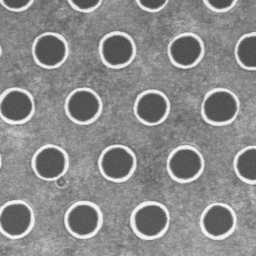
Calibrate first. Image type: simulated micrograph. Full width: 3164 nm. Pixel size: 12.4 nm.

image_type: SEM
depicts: a regular array of raised bodies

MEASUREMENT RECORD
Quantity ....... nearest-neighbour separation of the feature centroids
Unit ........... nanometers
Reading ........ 812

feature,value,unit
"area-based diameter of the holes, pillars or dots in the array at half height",430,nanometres